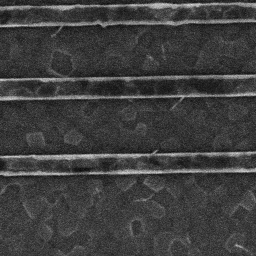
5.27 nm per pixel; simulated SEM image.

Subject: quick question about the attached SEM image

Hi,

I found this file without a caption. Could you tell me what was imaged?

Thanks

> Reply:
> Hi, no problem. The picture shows one or a few lines or trenches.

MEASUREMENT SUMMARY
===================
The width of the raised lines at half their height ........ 98.8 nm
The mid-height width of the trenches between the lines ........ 292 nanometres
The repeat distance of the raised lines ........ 74.6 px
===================